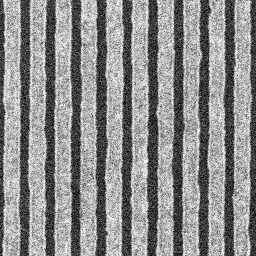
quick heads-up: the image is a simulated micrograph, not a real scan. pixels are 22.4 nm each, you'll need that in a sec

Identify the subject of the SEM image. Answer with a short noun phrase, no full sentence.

parallel lines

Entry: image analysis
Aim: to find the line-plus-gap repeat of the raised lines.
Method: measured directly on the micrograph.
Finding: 25.6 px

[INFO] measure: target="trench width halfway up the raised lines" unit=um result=0.261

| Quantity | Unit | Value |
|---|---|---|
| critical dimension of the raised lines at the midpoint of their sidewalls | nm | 306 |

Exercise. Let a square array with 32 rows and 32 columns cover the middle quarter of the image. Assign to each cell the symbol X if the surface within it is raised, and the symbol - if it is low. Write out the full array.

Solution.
X----XXX---XXX---XXXX---XXX---XX
X----XXX---XXX----XXX--XXXX---XX
X----XXX---XXX---XXXX--XXXX---XX
X----XXX---XXX---XXXX---XXX---XX
XX---XXX---XXX---XXXX---XXX---XX
XX---XXX---XXX---XXXX---XXX---XX
XX---XXX---XXX---XXXX---XXX---XX
XX---XXX---XXX---XXXX---XXX---XX
XX---XXX---XXX---XXXX---XXX---XX
XX---XXX---XXX---XXXX---XXX---XX
XX--XXXX---XXX----XXX---XXX---XX
XX---XXX---XXX---XXXX--XXXX---XX
XX--XXXX---XXX---XXXX--XXXX---XX
XX--XXXX---XXX----XXX---XXX----X
XX---XXX---XXX---XXXX---XXX----X
X----XXX---XXX---XXXX---XXX----X
X----XXX---XXX---XXXX---XXX----X
X----XXX---XXX---XXXX---XXX---XX
X----XXX---XXX---XXXX---XXX---XX
XX--XXXX---XXX----XXX---XXX---XX
XX--XXXX---XXX----XXX---XXX---XX
X---XXXX---XXX---XXX----XXX---XX
X---XXXX---XXX----XXX---XXX---XX
X---XXXX---XXX----XXX---XXX---XX
X----XXX---XXX----XXX---XXX---XX
X---XXXX---XXX---XXX----XXX---XX
X---XXXX---XXX---XXX----XXX---XX
X---XXXX---XXX---XXX----XXX---XX
X---XXXX---XXX---XXX----XXX---XX
XX--XXXX---XXX---XXX----XXX---XX
X---XXXX---XXX---XXX----XXX---XX
X---XXXX---XXX---XXX----XXX---XX